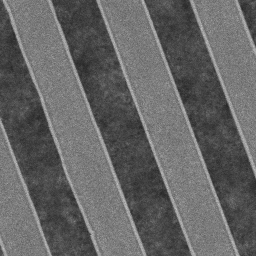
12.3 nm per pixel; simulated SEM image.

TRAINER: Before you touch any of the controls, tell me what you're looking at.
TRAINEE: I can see one or a few lines or trenches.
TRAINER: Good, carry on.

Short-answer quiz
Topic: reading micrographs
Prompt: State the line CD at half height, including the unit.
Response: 0.519 microns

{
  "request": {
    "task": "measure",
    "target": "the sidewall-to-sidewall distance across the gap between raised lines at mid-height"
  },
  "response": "566 nm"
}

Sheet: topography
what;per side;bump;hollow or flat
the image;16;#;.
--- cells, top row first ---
###...###...###.
.###...##....##.
.###...###...###
..##...###...###
..###...###...##
..###...###...##
...##....##...##
...###...###...#
...###...###...#
#...###...##...#
#...###...###...
##..###...###...
##...###...###..
##...###...###..
###...##....##..
###...###...###.